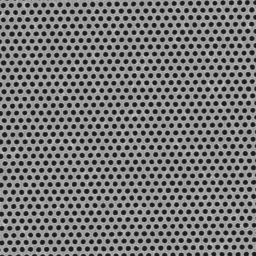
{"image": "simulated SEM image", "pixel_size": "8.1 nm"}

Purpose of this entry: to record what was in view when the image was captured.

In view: a regular array of holes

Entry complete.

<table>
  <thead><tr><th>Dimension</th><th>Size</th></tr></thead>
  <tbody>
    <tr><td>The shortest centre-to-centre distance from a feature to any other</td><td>63.5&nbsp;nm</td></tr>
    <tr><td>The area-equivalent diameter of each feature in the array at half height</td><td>0.0429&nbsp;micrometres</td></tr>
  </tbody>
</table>